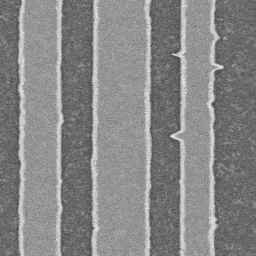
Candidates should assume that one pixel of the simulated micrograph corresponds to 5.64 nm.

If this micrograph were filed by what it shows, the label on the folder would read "one or a few lines or trenches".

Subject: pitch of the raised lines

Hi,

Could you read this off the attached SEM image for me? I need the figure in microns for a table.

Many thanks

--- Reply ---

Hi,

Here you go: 0.443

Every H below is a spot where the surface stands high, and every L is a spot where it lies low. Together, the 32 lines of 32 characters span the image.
LLLHHHHLLLLLHHHHHHLLLLLHHHHLLLLL
LLLHHHHLLLLLHHHHHHLLLLLHHHHLLLLL
LLLHHHHLLLLLHHHHHHLLLLLHHHLLLLLL
LLLHHHHLLLLLHHHHHHHLLLLHHHLLLLLL
LLLHHHHLLLLLHHHHHHHLLLLHHHHLLLLL
LLLHHHHLLLLLHHHHHHHLLLLHHHHLLLLL
LLLHHHHLLLLLHHHHHHHLLLHHHHLLLLLL
LLLHHHHLLLLLHHHHHHLLLLLHHHLLLLLL
LLLHHHHLLLLLHHHHHHHLLLLHHHHLLLLL
LLLHHHHLLLLLHHHHHHHLLLLHHHLLLLLL
LLLHHHHLLLLLHHHHHHLLLLLHHHLLLLLL
LLLHHHHLLLLLHHHHHHLLLLLHHHLLLLLL
LLLHHHHLLLLLHHHHHHLLLLLHHHLLLLLL
LLLHHHHLLLLLHHHHHHHLLLLHHHLLLLLL
LLLHHHHLLLLLHHHHHHLLLLLHHHHLLLLL
LLLHHHHHLLLLHHHHHHLLLLLHHHLLLLLL
LLLHHHHLLLLLHHHHHHLLLLHHHHLLLLLL
LLLHHHHLLLLLHHHHHHLLLLHHHHHLLLLL
LLLHHHHLLLLLHHHHHHHLLLLHHHHLLLLL
LLLHHHHLLLLLHHHHHHHLLLLHHHHLLLLL
LLLHHHHLLLLLHHHHHHHLLLLHHHLLLLLL
LLLHHHHLLLLLHHHHHHHLLLLHHHLLLLLL
LLLHHHHLLLLLHHHHHHHLLLLHHHLLLLLL
LLLHHHHLLLLLHHHHHHLLLLLHHHLLLLLL
LLLHHHHLLLLLHHHHHHLLLLLHHHLLLLLL
LLLHHHHLLLLLHHHHHHLLLLLHHHHLLLLL
LLLHHHHLLLLLHHHHHHLLLLLHHHHLLLLL
LLLHHHHLLLLLHHHHHHLLLLLHHHHLLLLL
LLLHHHHLLLLLHHHHHHLLLLLHHHHLLLLL
LLLHHHHLLLLLHHHHHHLLLLLHHHLLLLLL
LLLHHHHLLLLLHHHHHHLLLLLHHHLLLLLL
LLLHHHHLLLLLHHHHHHLLLLLHHHHLLLLL